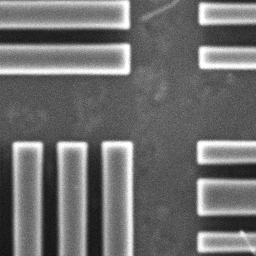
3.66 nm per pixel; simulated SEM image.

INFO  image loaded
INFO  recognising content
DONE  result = groups of lines, slits or small figures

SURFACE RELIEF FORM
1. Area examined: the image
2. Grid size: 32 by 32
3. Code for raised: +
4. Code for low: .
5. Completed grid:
++++++++++++++++................
++++++++++++++++.........+++++++
++++++++++++++++.........+++++++
.....++.........................
................................
................................
++++++++++++++++.........+++++++
++++++++++++++++.........+++++++
++++++++++++++++................
................................
................................
................................
................................
................................
................................
................................
................................
................................
..+++..++++..+++.........+++++++
..+++..++++..+++.........+++++++
..+++..++++..+++................
..+++..++++..+++................
..+++..++++..+++................
..+++..++++..+++.........+++++++
..+++..++++..+++.........+++++++
..+++..++++..+++.........+++++++
..+++..++++..+++.........+++++++
..+++..++++..+++................
..+++..++++..+++................
..+++..++++..+++.........+++++++
..+++..++++..+++.........+++++++
..+++..++++..+++................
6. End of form